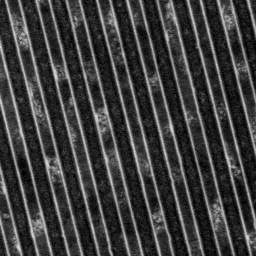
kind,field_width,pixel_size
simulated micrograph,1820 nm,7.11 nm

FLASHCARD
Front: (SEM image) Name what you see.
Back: parallel lines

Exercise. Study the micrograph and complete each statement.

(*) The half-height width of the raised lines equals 92.3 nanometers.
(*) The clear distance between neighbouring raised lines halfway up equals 116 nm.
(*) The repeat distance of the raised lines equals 209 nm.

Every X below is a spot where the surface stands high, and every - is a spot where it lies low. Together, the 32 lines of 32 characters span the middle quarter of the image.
-----XXX----XXXX----XXX----XXXX-
X----XXX-----XXX----XXX-----XXX-
X----XXX-----XXX----XXX-----XXX-
X----XXXX----XXX-----XXX----XXXX
X-----XXX----XXXX----XXX----XXXX
XX----XXX----XXXX----XXX-----XXX
XX----XXX-----XXX----XXXX----XXX
XX----XXXX----XXX-----XXX----XXX
XX-----XXX----XXXX----XXX----XXX
XXX----XXX----XXXX----XXX-----XX
XXX----XXX-----XXX----XXXX----XX
XXX----XXXX----XXX----XXXX----XX
XXX-----XXX----XXXX----XXX----XX
XXXX----XXX-----XXX----XXX----XX
-XXX----XXX-----XXX----XXXX----X
-XXX----XXXX----XXX-----XXX----X
-XXX-----XXX----XXXX----XXX----X
-XXXX----XXX-----XXX----XXX----X
--XXX----XXX-----XXX----XXXX----
--XXX----XXXX----XXX-----XXX----
--XXX-----XXX----XXXX----XXX----
--XXXX----XXX----XXXX----XXX----
---XXX----XXX-----XXX----XXXX---
---XXX----XXXX----XXX----XXXX---
---XXX-----XXX----XXX-----XXX---
---XXXX----XXX----XXXX----XXX---
----XXX----XXX-----XXX----XXXX--
----XXX----XXXX----XXX-----XXX--
----XXX-----XXX----XXX-----XXX--
----XXXX----XXX-----XXX----XXX--
----XXXX----XXX-----XXX----XXXX-
-----XXX----XXXX----XXX-----XXX-